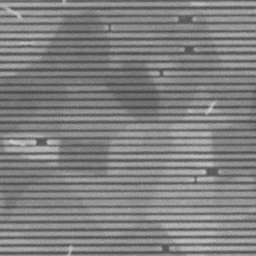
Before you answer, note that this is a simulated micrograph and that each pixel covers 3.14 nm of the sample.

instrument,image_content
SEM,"parallel lines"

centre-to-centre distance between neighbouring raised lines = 24 nm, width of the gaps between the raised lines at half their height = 11 nm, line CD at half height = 13.7 nm